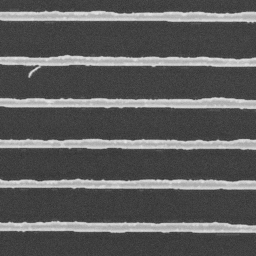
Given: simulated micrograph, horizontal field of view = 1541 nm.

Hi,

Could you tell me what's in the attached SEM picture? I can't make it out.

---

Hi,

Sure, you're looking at lines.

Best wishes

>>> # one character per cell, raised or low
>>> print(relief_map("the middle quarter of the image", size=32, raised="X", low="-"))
--------------------------------
--------------------------------
--------------------------------
--------------------------------
--------------------------------
--------------------------------
--------------------------------
--------------------------------
--------------------------------
XXXXXXXXXXXXXXXXXXXXXXXXXXXXXXXX
-XXXXXXXXXXXXXXXXXXXXXXXXXXXXXXX
--------------------------------
--------------------------------
--------------------------------
--------------------------------
--------------------------------
--------------------------------
--------------------------------
--------------------------------
XXXXXXXXXXXXXXXXXXXXXXXXXXXXXX-X
XXXXXXXXXXXXXXXXXXXXXXXXXXXXXXXX
--------------------------------
--------------------------------
--------------------------------
--------------------------------
--------------------------------
--------------------------------
--------------------------------
--------------------------------
XXXXXXXXXXXXXXX--XXXXXXXXXXXXXXX
XXXXXXXXXXXXXXXXXXXXXXXXXXXXXXXX
--------------------------------